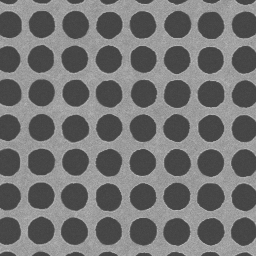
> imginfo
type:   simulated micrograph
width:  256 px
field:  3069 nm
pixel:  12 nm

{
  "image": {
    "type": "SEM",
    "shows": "a regular array of holes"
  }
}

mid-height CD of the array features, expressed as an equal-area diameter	320	nm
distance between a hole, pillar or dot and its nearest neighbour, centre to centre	33.6	pixels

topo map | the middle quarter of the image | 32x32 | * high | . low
......**......***......***.....*
*....****....*****....****....**
****************************.***
********************************
*...*****....*****...*****....**
.....***......***......**......*
......**......***......**......*
......**......***......**......*
......**......***......**......*
.....****.....***......**......*
**..******...*****...******...**
********************************
********************************
*....****....*****....****....**
......**......***......**......*
......**.......*.......**......*
......**......**.......**......*
......**......***......**......*
.....****....*****....****....**
**.****************.********.***
********************************
**..*******.******...******..***
.....****.....***.....****.....*
......**......***......**......*
......**.......*.......**.......
......**......**.......**.......
.....****.....***.....***......*
*...*****....*****...******...**
********************************
********************************
*....****....*****....****....**
......**......***......**......*